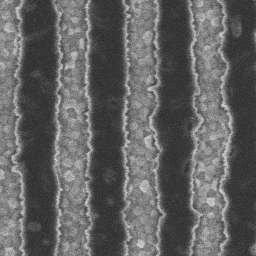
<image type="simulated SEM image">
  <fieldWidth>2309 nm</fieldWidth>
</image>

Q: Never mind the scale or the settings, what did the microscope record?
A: one or a few lines or trenches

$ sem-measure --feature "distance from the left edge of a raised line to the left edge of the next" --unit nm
615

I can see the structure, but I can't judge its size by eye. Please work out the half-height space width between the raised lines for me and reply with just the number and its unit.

260 nanometers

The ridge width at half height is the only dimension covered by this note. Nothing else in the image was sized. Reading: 0.355 microns